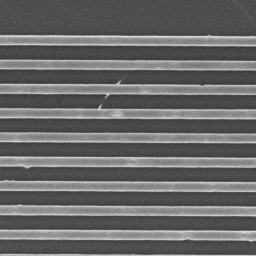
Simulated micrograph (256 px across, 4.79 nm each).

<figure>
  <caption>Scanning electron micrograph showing parallel lines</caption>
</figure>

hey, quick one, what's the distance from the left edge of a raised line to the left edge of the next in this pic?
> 116 nm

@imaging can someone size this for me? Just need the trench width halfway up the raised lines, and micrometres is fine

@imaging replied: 0.0736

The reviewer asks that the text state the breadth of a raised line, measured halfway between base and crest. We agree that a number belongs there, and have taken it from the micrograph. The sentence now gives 44.9 nanometres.